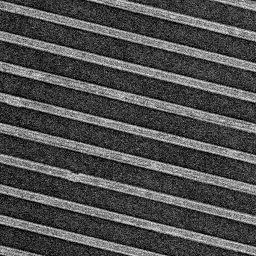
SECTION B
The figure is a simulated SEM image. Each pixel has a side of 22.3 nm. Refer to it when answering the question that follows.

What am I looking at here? parallel lines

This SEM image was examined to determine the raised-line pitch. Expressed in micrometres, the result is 0.662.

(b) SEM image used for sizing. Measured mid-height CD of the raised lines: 7.41 px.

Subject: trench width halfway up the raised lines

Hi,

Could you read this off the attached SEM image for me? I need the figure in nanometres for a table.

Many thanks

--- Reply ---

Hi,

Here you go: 492